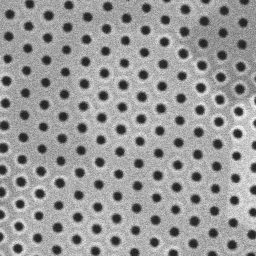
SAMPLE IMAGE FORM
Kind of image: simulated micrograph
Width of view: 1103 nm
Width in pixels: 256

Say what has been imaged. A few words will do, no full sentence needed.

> a regular array of holes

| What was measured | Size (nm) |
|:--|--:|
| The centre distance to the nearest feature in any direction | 95.5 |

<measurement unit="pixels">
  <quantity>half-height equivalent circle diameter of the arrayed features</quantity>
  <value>9.14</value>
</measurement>